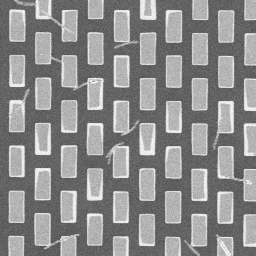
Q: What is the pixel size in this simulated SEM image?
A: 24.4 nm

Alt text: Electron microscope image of groups of lines, slits or small figures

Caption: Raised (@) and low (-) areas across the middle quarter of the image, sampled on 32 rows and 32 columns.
@@@----------@@@----------@@@---
@@@----------@@@----------@@@---
@@@----------@@@----------@@@---
@@@----------@@@----------@@@---
@@@---@@@@---@@@---@@@@---@@@---
@@@---@@@----@@@---@@@@---@@@---
------@@@----------@@@@---------
------@@@----------@@@@---------
------@@@----------@@@@---------
@@@---@@@-----@@---@@@@---------
@@@---@@@----@@@---@@@@---@@@---
@@@----------@@@----------@@@---
@@@----------@@@----------@@@---
@@@----------@@@----------@@@---
@@@----------@@@----------@@@---
@@@---@@@----@@@---@@@@---@@@---
@@@---@@@----@@@@--@@@@---@@@---
------@@@@---------@@@----------
------@@@@---------@@@----------
------@@@@---------@@@----------
------@@@@---@-----@@@----------
@@@---@@@@--@@@@----@@----@@@---
@@@---@@@@--@@@@----------@@@---
@@@---------@@@@----------@@@---
@@@---------@@@@----------@@@---
@@@---------@@@@----------@@@---
@@@---@@@---@@@@---@@@----@@@---
@@@---@@@@--@@@@---@@@@---@@@---
------@@@@---------@@@@---------
------@@@@---------@@@@---------
------@@@----------@@@@---------
------@@@----------@@@@---------